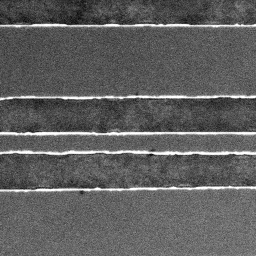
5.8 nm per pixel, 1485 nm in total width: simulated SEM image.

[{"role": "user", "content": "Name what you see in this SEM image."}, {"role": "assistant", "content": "lines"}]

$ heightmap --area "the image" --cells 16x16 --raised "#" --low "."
................
................
################
################
################
################
................
................
################
################
................
................
################
################
################
################